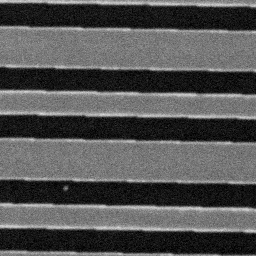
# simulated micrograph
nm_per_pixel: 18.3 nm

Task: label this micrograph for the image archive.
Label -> lines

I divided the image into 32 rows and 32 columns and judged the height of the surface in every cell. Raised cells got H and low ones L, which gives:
LLLLLLLLLLLLLLLLLLLLHHHHHHHHHHHH
LLLLLLLLLLLLLLLLLLLLLLLLLLLLLLLL
LLLLLLLLLLLLLLLLLLLLLLLLLLLLLLLL
HHHHLLLLLLLLLLLLLLLLLLLLLLLLLLLL
HHHHHHHHHHHHHHHHHHHHHHHHHHHHHHHH
HHHHHHHHHHHHHHHHHHHHHHHHHHHHHHHH
HHHHHHHHHHHHHHHHHHHHHHHHHHHHHHHH
HHHHHHHHHHHHHHHHHHHHHHHHHHHHHHHH
LLLLLLLLLLLLHHHHHHHHHHHHHHHHHHHH
LLLLLLLLLLLLLLLLLLLLLLLLLLLLLLLL
LLLLLLLLLLLLLLLLLLLLLLLLLLLLLLLL
HHHHHLLLLLLLLLLLLLLLLLLLLLLLLLLL
HHHHHHHHHHHHHHHHHHHHHHHHHHHHHHHH
HHHHHHHHHHHHHHHHHHHHHHHHHHHHHHHH
LLLLLLLLLLLLLLLLLHHHHHHHHHHHHHHH
LLLLLLLLLLLLLLLLLLLLLLLLLLLLLLLL
LLLLLLLLLLLLLLLLLLLLLLLLLLLLLLLL
HHHHHHHHHHHLLLLLLLLLLLLLLLLLLLLL
HHHHHHHHHHHHHHHHHHHHHHHHHHHHHHHH
HHHHHHHHHHHHHHHHHHHHHHHHHHHHHHHH
HHHHHHHHHHHHHHHHHHHHHHHHHHHHHHHH
HHHHHHHHHHHHHHHHHHHHHHHHHHHHHHHH
LLLLLLLLLHHHHHHHHHHHHHHHHHHHHHHH
LLLLLLLLLLLLLLLLLLLLLLLLLLLLLLLL
LLLLLLLLLLLLLLLLLLLLLLLLLLLLLLLL
LLLLLLLLLLLLLLLLLLLLLLLLLLLLLLLL
HHHHHHHHHHHHHHHHHHHHHHHHHHHHHHHH
HHHHHHHHHHHHHHHHHHHHHHHHHHHHHHHH
LLLLLLLHHHHHHHHHHHHHHHHHHHHHHHHH
LLLLLLLLLLLLLLLLLLLLLLLLLLLLLLLL
LLLLLLLLLLLLLLLLLLLLLLLLLLLLLLLL
HHHHLLLLLLLLLLLLLLLLLLLLLLLLLLLL